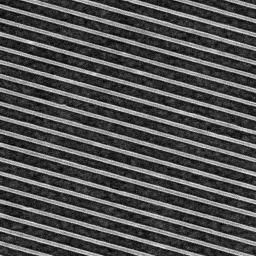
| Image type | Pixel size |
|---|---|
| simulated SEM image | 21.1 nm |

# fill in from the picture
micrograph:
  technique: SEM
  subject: parallel lines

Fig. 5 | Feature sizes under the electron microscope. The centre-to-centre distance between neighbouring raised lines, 0.283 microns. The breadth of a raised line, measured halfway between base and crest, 63.6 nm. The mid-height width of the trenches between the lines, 221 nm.